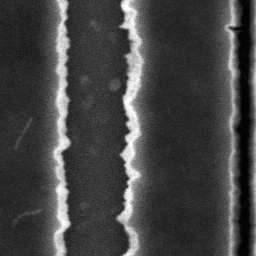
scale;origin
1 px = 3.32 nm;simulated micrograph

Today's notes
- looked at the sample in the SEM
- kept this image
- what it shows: one or a few lines or trenches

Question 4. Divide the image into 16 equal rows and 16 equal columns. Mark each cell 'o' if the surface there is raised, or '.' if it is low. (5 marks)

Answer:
oooo....ooooooo.
oooo....ooooooo.
oooo....ooooooo.
oooo....ooooooo.
oooo....ooooooo.
oooo....ooooooo.
oooo....ooooooo.
oooo....ooooooo.
oooo....ooooooo.
oooo....ooooooo.
oooo....ooooooo.
oooo....ooooooo.
oooo....ooooooo.
oooo....ooooooo.
oooo....ooooooo.
oooo....ooooooo.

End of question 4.